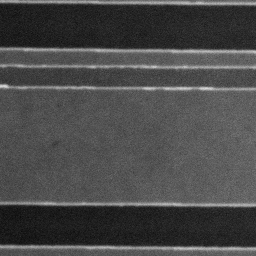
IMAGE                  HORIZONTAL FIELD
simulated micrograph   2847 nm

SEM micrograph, lines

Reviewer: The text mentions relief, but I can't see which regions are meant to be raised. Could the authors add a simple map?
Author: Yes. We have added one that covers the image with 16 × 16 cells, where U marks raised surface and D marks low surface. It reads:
DDDDDDDDDDDDDDDD
DDDDDDDDDDDDDDDD
DDDDDDDDDDDDDDDD
UUUUUUUUUUUUUUUU
UUUUUUUUUUUUUUUU
UUUUUUUUUUUUUUUU
UUUUUUUUUUUUUUUU
UUUUUUUUUUUUUUUU
UUUUUUUUUUUUUUUU
UUUUUUUUUUUUUUUU
UUUUUUUUUUUUUUUU
UUUUUUUUUUUUUUUU
UUUUUUUUUUUUUUUU
DDDDDDDDDDDDDDDD
DDDDDDDDDDDDDDDD
UUUUUUUUDDDDDDDD